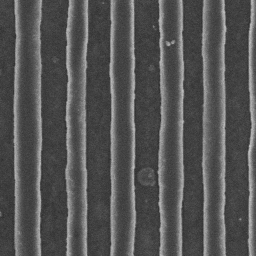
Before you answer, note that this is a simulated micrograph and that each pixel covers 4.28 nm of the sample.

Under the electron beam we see lines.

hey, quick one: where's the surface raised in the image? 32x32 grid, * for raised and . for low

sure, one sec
..***....**...***...***...**....
..***....**...***...***...**....
..***....**...***...***...**...*
..***...***...***...***...**...*
..***...***...***...***...**...*
..***...***...***...***..***...*
..***...***...***...***..***...*
..***...***...***...***...**...*
..***...***...***...***...**...*
..***....**...***...***...**...*
..***....**...***...***...**...*
..***....*....***...***...**...*
..***...**....***...***...**...*
..***...**....***...***...**...*
..***...***...***...***...**....
..***...***...***...***...**....
..***...***...***...***...**....
..***...***...***...***...**...*
..***...***...***...***...**...*
..***....**...***...***...**...*
..***...***...***...***...**...*
..***...***...***...***...**...*
..***...***...***...***...**...*
..***...***...***...***...**...*
..***....**...***...***...**...*
..***....**...***...***...**...*
..***....**...***...***...**...*
..***....**...***...***...**...*
..***....**...***...***...**...*
..***...***...***...***...**...*
..***...***...***...***...**...*
..***...***...***...***...**...*